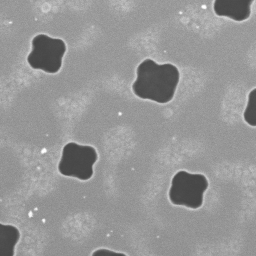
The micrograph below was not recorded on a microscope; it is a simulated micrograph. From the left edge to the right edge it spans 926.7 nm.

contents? holes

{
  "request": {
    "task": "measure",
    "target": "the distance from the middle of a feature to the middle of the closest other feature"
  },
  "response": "406 nanometers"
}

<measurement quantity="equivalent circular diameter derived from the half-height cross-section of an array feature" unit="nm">131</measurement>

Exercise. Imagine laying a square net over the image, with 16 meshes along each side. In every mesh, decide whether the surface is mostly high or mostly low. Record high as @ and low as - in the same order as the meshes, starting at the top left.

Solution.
@@@@@@@@@@@@@---
@@@@@@@@@@@@@@@@
@@--@@@@@@@@@@@@
@@--@@@@@@@@@@@@
@@@@@@@@@--@@@@@
@@@@@@@@---@@@@@
@@@@@@@@@@@@@@@-
@@@@@@@@@@@@@@@-
@@@@@@@@@@@@@@@@
@@@@--@@@@@@@@@@
@@@@--@@@@@@@@@@
@@@@@@@@@@@--@@@
@@@@@@@@@@@--@@@
@@@@@@@@@@@@@@@@
-@@@@@@@@@@@@@@@
-@@@@@@@@@@@@@@@